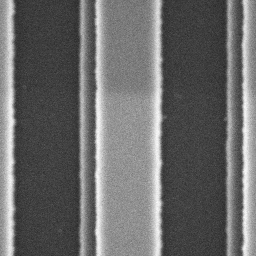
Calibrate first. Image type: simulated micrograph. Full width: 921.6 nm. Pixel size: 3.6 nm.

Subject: lines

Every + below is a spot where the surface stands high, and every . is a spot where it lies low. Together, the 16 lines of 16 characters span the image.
+....+++++....++
+....+++++....++
+....+++++....++
+....+++++....++
+....+++++....++
+....+++++....++
+....+++++....++
+....+++++....++
+....+++++....++
+....+++++....++
+....+++++....++
+....+++++....++
+....+++++....++
+....+++++....++
+....+++++....++
+....+++++....++